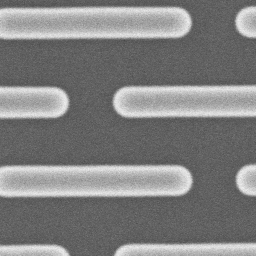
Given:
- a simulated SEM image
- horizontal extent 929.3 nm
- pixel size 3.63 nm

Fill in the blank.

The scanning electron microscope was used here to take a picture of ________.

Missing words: groups of lines, slits or small figures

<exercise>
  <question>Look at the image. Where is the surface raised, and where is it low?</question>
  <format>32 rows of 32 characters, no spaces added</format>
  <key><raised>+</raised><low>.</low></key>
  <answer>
................................
+++++++++++++++++++++++.......++
++++++++++++++++++++++++......++
++++++++++++++++++++++++......++
+++++++++++++++++++.............
................................
................................
................................
................................
................................
................................
++++++++.......+++++++++++++++++
++++++++......++++++++++++++++++
++++++++.......+++++++++++++++++
++++............................
................................
................................
................................
................................
................................
................................
+++++++++++++++++++++++.......++
++++++++++++++++++++++++......++
++++++++++++++++++++++++......++
................................
................................
................................
................................
................................
................................
................................
++++++++.......+++++++++++++++++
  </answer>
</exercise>